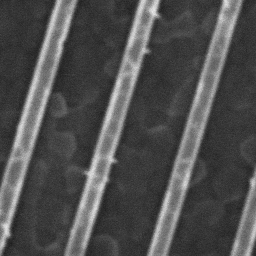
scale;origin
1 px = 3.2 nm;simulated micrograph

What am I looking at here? one or a few lines or trenches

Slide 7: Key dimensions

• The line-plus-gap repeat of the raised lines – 254 nanometers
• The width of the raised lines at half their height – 0.0537 microns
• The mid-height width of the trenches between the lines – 0.203 microns